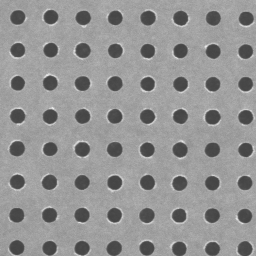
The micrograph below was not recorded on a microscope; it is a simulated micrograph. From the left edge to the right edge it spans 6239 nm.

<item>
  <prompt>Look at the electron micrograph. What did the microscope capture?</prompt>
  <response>a regular array of holes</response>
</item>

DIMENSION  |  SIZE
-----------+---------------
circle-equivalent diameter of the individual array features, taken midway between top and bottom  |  367 nanometers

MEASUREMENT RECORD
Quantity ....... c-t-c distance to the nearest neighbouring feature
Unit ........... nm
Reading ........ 790